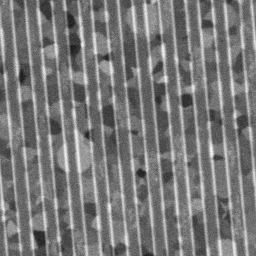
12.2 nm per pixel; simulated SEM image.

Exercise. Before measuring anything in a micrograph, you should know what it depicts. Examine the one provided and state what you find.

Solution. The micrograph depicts parallel lines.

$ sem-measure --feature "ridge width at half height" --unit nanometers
172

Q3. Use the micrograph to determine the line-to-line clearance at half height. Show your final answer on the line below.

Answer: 13.1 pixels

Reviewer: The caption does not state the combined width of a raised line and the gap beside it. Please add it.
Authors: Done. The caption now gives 0.325 micrometres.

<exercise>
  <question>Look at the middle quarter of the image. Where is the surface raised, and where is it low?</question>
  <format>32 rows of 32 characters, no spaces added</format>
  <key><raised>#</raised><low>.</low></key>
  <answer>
..###...####...###....###...####
..###...####...####...###....###
..###....###...####...###....###
..###....###...####...###....###
..###....###...####...###....###
..###....###....###...###....###
..###....###....###...####...###
..###....###....###...####...###
..####...###....###...####...###
..####...###....###...####...###
..####...####...###....###...###
...###...####...###....###...###
...###...####...####...###....##
...###...####...####...###....##
...###....###...####...###....##
...###....###...####...###....##
...####...###....###...###....##
...####...###....###...####...##
...####...###....###...####...##
...####...###....###...####...##
....###...###....###...####...##
....###...####...###....###...##
....###...####...###....###...##
....###...####...####...###....#
....###...####...####...###....#
#...###....###...####...###....#
#...###....###...####...###....#
#...###....###....###...###....#
#...###....###....###...####...#
#...###....###....###...####...#
#...####...###....###...####...#
#....###...###....###...####...#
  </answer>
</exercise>